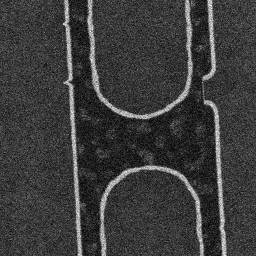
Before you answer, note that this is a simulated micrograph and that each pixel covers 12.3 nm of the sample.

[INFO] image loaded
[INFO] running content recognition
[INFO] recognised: one or a few lines or trenches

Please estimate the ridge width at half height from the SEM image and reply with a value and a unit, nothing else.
24.2 px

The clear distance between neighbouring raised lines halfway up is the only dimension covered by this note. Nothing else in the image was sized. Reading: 1.17 micrometres